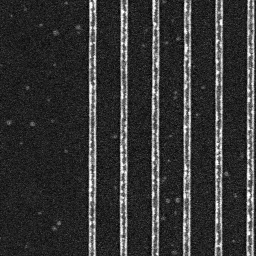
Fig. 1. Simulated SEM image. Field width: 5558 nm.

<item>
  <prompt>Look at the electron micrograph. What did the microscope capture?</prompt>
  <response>parallel lines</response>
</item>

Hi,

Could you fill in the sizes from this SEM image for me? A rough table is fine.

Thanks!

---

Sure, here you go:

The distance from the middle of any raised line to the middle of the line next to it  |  686 nm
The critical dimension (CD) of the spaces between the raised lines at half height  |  551 nm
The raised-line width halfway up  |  133 nanometers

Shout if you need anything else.